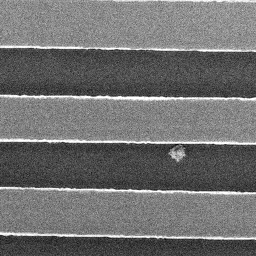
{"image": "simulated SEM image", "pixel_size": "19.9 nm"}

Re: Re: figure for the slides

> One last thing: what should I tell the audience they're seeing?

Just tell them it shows lines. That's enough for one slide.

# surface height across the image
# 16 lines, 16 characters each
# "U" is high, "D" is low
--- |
UUUUUUUUUUUUUUUU
UUUUUUUUUUUUUUUU
UUUUUUUUUUUUUUUU
DDDDDDDDDDDDDDDD
DDDDDDDDDDDDDDDD
DDDDDDDDDDDDDDDD
UUUUUUUUUUUUUUUU
UUUUUUUUUUUUUUUU
UUUUUUUUUUUUUUUU
DDDDDDDDDDDDDDDD
DDDDDDDDDDDDDDDD
DDDDDDDDDDDDDDDD
UUUUUUUUUUUUUUUU
UUUUUUUUUUUUUUUU
UUUUUUUUUUUUUUUU
DDDDDDDDDDDDDDDD